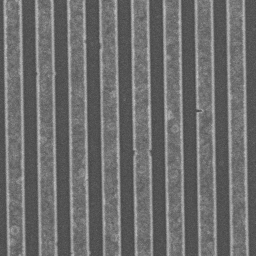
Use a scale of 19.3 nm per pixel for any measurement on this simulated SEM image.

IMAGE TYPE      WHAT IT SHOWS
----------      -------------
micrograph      parallel lines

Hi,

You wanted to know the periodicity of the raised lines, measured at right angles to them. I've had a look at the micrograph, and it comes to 614 nm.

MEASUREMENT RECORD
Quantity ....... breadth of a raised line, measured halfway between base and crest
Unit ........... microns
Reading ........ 0.323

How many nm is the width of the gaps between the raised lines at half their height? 289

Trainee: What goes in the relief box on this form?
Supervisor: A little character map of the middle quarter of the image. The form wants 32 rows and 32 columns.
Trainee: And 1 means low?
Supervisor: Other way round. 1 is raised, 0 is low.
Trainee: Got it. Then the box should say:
01111000011110000111100001111000
01111000011110000111100001111000
01111000011110000111100001111000
01111000011110000111100001111000
01111000011110000111100001111000
01111000011110000111100001111000
01111000011110000111100001111000
01111000011110000111100001111000
01111000011110000111100001111000
00111000011110000111100001111000
00111000011110000111100001111000
00111100011110000111100001111000
00111100011110000111100001111000
00111100001110000111100001111000
00111100001110000111100001111000
00111100001111000111100001111000
00111100001111000011100001111000
00111100001111000011100001111000
00111100001111000011100001111000
00111100001111000011110001111000
00111100001111000011110000111000
00111100001111000011100000111000
00111100001111000011100000111100
00111100001111000011110000111100
00111100001111000011110000111100
00111100001111000011110000111100
00111100001111000011110000111100
00111100001111000011110000111100
00111100001111000011110000111100
00111100001111000011110000111100
00111100001111000011110000111100
00111100001111000011110000111100